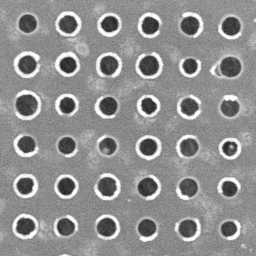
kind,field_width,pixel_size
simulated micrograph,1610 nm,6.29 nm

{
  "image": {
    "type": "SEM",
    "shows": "a regular array of holes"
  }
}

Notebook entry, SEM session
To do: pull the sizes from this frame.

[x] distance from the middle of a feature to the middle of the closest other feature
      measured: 40.2 pixels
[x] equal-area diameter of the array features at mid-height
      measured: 116 nanometres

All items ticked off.